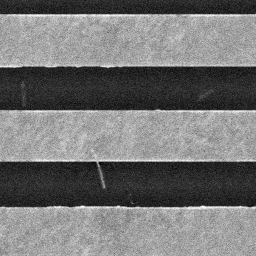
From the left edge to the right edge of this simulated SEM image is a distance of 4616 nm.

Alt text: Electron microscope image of lines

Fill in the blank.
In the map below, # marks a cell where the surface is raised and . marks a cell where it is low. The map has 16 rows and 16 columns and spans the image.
................
################
################
################
................
................
................
################
################
################
................
................
................
################
################
################